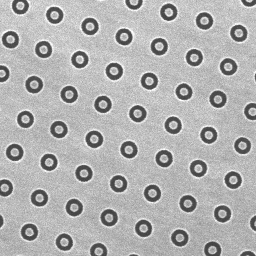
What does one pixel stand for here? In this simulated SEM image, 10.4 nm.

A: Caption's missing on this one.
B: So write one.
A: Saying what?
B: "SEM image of a regular array of ring-shaped grooves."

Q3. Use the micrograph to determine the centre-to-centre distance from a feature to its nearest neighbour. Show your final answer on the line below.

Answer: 364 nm